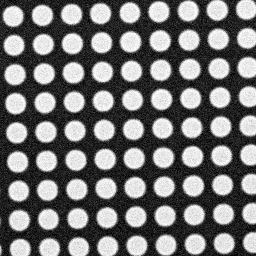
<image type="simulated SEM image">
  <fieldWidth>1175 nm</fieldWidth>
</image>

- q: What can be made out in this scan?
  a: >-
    an array of small figures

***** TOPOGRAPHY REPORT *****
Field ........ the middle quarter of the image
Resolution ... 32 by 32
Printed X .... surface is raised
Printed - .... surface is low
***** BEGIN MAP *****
-XXX----XXX----XXXX---XXXX---XXX
XXXXX--XXXXX---XXXX---XXXXX--XXX
XXXXX--XXXXX---XXXX---XXXX---XXX
XXXX----XXXX---XXXX----XXX----XX
--X-----------------------------
--------------------------------
------------------------X------X
-XXX----XXX----XXXX---XXXX----XX
XXXXX---XXXX---XXXX---XXXXX--XXX
XXXXX--XXXXX---XXXX---XXXXX--XXX
XXXXX---XXXX---XXXX----XXX----XX
-XXX-----XX---------------------
--------------------------------
--------------------------------
--X------XX-----XXX----XXX----XX
-XXXX---XXXX---XXXXX--XXXXX---XX
XXXXX---XXXX---XXXXX--XXXXX---XX
XXXXX---XXXX---XXXX----XXXX---XX
-XXX-----XXX----XX--------------
--------------------------------
--------------------------------
----------X-----XXX----XXX----XX
-XXXX---XXXX---XXXXX---XXXX---XX
-XXXX---XXXXX--XXXXX--XXXXX---XX
-XXXX---XXXXX--XXXXX---XXXX---XX
-XXXX---XXXX----XXX-----XX-----X
--------------------------------
--------------------------------
------------------------XX-----X
--XXX----XXX----XXXX---XXXX---XX
-XXXX---XXXXX--XXXXX---XXXX---XX
-XXXXX--XXXXX--XXXXX---XXXX---XX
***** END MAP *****